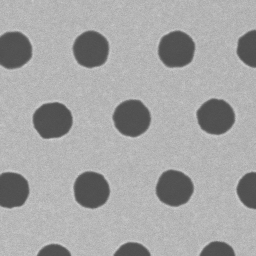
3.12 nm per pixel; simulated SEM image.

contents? holes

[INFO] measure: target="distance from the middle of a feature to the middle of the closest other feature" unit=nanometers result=247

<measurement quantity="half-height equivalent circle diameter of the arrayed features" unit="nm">114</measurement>